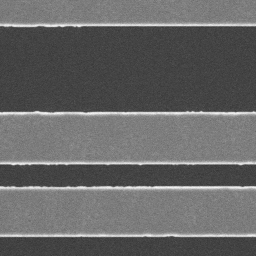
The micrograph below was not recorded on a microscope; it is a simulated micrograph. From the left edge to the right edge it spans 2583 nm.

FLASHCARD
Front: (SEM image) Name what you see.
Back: lines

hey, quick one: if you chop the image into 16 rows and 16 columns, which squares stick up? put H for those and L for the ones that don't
HHHHHHHHHHHHHHHH
HHHHHHHHHHHHHHHH
LLLLLLLLLLLLLLLL
LLLLLLLLLLLLLLLL
LLLLLLLLLLLLLLLL
LLLLLLLLLLLLLLLL
LLLLLLLLLLLLLLLL
HHHHHHHHHHHHHHHH
HHHHHHHHHHHHHHHH
HHHHHHHHHHHHHHHH
LLLLLLLLLLLLLLLL
LLLLLLLLLLLLLLLL
HHHHHHHHHHHHHHHH
HHHHHHHHHHHHHHHH
HHHHHHHHHHHHHHHH
LLLLLLLLLLLLLLLL